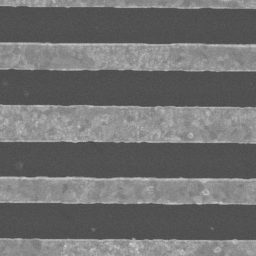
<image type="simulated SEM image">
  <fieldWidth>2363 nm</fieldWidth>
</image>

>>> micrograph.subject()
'lines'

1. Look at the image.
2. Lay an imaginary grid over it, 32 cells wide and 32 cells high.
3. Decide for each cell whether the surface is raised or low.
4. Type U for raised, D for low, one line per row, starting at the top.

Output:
UUUUUUUUUUUUUUUUUUUUUUUUUUUUUUUU
DDDDDDDDDDDDDDDDDDDDDDDDDDDDDDDD
DDDDDDDDDDDDDDDDDDDDDDDDDDDDDDDD
DDDDDDDDDDDDDDDDDDDDDDDDDDDDDDDD
DDDDDDDDDDDDDDDDDDDDDDDDDDDDDDDD
UUUUUUUUUUUUUUUUUUUDDUUUUDDDDDDD
UUUUUUUUUUUUUUUUUUUUUUUUUUUUUUUU
UUUUUUUUUUUUUUUUUUUUUUUUUUUUUUUU
UUUUUUUUUUUUUUUUUUUUUUUUUUUUUUUU
DDDDDDDDDDDDDDDDDDDDDDDDDDDDDDDD
DDDDDDDDDDDDDDDDDDDDDDDDDDDDDDDD
DDDDDDDDDDDDDDDDDDDDDDDDDDDDDDDD
DDDDDDDDDDDDDDDDDDDDDDDDDDDDDDDD
UUUUUUUUUUUUUUUUUUUUUUUUUUUUUUDU
UUUUUUUUUUUUUUUUUUUUUUUUUUUUUUUU
UUUUUUUUUUUUUUUUUUUUUUUUUUUUUUUU
UUUUUUUUUUUUUUUUUUUUUUUUUUUUUUUU
UUUUUUUUUUUUUUUUUUUUUUUUUUUUUUUU
DDDDDDDDDDDDDDDDDDDDDDDDDDDDDDDD
DDDDDDDDDDDDDDDDDDDDDDDDDDDDDDDD
DDDDDDDDDDDDDDDDDDDDDDDDDDDDDDDD
DDDDDDDDDDDDDDDDDDDDDDDDDDDDDDDD
UUUUUUUUUUUUUUUUUUUUUUUUUUUUUUUU
UUUUUUUUUUUUUUUUUUUUUUUUUUUUUUUU
UUUUUUUUUUUUUUUUUUUUUUUUUUUUUUUU
DDDDDDDDDDDDDDDDDDDDDDDDDDDDDDDD
DDDDDDDDDDDDDDDDDDDDDDDDDDDDDDDD
DDDDDDDDDDDDDDDDDDDDDDDDDDDDDDDD
DDDDDDDDDDDDDDDDDDDDDDDDDDDDDDDD
DDDDDDDDDDDDDDDDDDDDDDDDDDDDDDDD
UUUUUUUUUUUUUUUUUUUUUUUUUUUUUUUU
UUUUUUUUUUUUUUUUUUUUUUUUUUUUUUUU